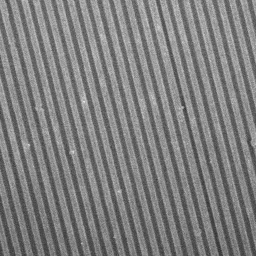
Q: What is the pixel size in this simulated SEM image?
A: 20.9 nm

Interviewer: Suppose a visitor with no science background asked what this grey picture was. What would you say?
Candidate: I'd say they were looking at parallel lines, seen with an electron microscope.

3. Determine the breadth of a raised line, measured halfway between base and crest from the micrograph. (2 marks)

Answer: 112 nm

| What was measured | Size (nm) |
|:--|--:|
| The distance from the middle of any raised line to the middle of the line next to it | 234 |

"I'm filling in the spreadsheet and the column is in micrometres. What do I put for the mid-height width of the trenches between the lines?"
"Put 0.112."